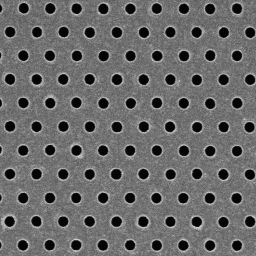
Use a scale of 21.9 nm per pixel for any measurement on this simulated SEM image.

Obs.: a regular array of holes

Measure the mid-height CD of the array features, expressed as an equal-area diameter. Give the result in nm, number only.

230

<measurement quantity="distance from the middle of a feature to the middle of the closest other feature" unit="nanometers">576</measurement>